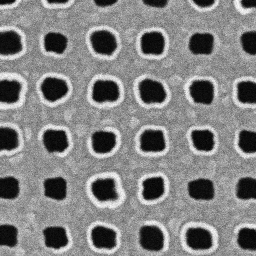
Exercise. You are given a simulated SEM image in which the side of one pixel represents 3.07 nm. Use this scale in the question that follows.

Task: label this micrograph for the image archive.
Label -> a regular array of holes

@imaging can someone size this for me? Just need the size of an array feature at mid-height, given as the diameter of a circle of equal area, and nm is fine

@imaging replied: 72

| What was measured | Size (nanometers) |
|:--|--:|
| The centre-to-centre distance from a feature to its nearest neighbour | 146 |